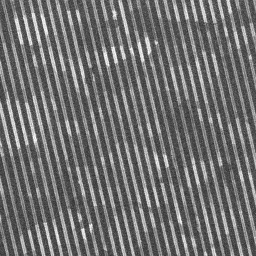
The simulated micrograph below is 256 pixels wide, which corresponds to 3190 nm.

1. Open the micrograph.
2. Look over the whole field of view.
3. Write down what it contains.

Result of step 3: parallel lines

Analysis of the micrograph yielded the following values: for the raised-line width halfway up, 25.8 nm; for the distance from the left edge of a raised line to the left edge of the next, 8.76 pixels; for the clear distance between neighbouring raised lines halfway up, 6.82 pixels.